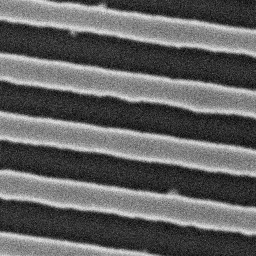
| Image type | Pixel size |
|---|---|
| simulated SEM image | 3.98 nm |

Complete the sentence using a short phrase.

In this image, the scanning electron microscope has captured lines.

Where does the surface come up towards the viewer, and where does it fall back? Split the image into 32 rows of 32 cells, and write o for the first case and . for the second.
ooooooo.........................
ooooooooooooooo.................
.oooooooooooooooooooooo.........
........ooooooooooooooooooooo...
...............ooooooooooooooooo
.....................ooooooooooo
.............................ooo
ooooo...........................
oooooooooooo....................
ooooooooooooooooooo.............
...ooooooooooooooooooooooo......
..........oooooooooooooooooooooo
................oooooooooooooooo
.......................ooooooooo
oo.............................o
oooooooooo......................
ooooooooooooooooo...............
.oooooooooooooooooooooo.........
........oooooooooooooooooooooo..
...............ooooooooooooooooo
......................oooooooooo
oo..........................oooo
ooooooo.........................
ooooooooooooooo.................
oooooooooooooooooooooo..........
......oooooooooooooooooooooo....
..............oooooooooooooooooo
.....................ooooooooooo
..........................oooooo
ooo.............................
oooooooooo......................
ooooooooooooooooo...............